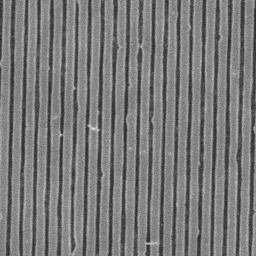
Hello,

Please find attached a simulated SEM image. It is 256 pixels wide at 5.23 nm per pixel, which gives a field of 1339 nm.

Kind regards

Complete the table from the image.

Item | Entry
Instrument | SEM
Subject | parallel lines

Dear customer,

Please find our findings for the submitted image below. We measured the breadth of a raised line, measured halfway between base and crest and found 41.8 nm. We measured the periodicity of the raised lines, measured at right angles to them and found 66.7 nanometers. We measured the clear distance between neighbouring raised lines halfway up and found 23.5 nm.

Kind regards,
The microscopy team